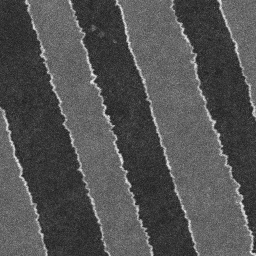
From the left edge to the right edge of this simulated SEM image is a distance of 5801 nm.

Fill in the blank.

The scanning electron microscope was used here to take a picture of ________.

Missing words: one or a few lines or trenches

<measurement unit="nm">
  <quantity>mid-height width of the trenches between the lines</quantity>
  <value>1000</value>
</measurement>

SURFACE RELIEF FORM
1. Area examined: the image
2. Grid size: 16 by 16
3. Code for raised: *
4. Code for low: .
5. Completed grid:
..***..****...**
..***...***...**
..***...****...*
...**...****...*
...***...***...*
...***...****...
....**...****...
....***...***...
*...***...****..
*....**...****..
*....***...***..
**...***...****.
**....**...****.
**....***...***.
***...***...****
***....**...****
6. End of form